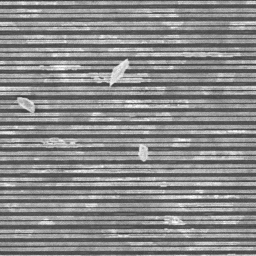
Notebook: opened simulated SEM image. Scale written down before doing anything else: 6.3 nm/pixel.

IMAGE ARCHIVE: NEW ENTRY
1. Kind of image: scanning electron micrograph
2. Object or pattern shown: parallel lines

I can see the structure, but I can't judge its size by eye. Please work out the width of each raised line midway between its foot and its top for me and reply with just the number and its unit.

3 px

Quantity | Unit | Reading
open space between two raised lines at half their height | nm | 28.4